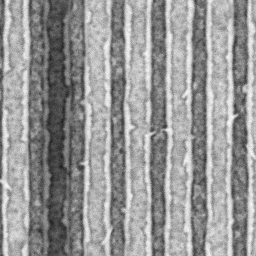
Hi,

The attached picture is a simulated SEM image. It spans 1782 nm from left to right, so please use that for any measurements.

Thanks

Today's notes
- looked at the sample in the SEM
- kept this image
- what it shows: parallel lines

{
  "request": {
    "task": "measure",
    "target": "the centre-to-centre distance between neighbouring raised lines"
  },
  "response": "284 nm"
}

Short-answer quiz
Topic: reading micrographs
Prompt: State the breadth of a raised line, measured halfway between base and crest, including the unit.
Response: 172 nm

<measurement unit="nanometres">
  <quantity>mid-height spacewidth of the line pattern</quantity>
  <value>112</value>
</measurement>